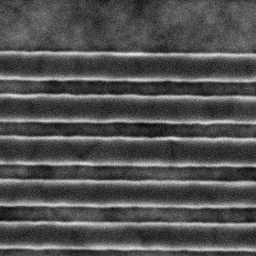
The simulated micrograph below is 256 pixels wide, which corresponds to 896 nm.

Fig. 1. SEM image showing wiring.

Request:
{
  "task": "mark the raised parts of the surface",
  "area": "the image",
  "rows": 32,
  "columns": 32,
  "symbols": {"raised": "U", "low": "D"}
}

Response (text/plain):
DDDDDDDDDDDDDDDDDDDDDDDDDDDDDDDD
DDDDDDDDDDDDDDDDDDDDDDDDDDDDDDDD
DDDDDDDDDDDDDDDDDDDDDDDDDDDDDDDD
DDDDDDDDDDDDDDDDDDDDDDDDDDDDDDDD
DDDDDDDDDDDDDDDDDDDDDDDDDDDDDDDD
DDDDDDDDDDDDDDDDDDDDDDDDDDDDDDDD
UUUDDUDDDDDDDDDDDDDDDDDDDDDDDDDD
UUUUUUUUUUUUUUUUDDUUUUUUUUUUUUUU
UUUUUUUUUUUUUUUUDDUUUUUUUUUUUUUU
UUUUUUUUUUUUUUUUUUUUUUUUUUUUUUUU
DDDDDDDDDDDDDDDDDDDDDDDDDDDDDDDD
DDDDDDDDDDDDDDDDDDDDDDDDDDDDDDDD
UUUUUUUUUUUUUUUUUUUUUUUUUUUUUUUU
UUUUUUUUUUUUUUUUUUUUUUUUUUUUUUUU
UUUUUUUUUUUUUUUUUUUUUUUUUUUUUUUU
DDDDDDDDDDDDDDDDDDDDDDDDDDDDDDDD
DDDDDDDDDDDDDDDDDDDDDDDDDDDDDDDD
UUUUUUUUUUUUUUUUUUUUUDUUUUUUUUUU
UUUUUUUUUUUUUUUUUUUUUUUUUUUUUUUU
UUUUUUUUUDDUUUUUUUUUUUUUUUUUUUUU
UUUDUUUUUDDUUUUUUUUUUUUUUUUUUUUU
DDDDDDDDDDDDDDDDDDDDDDDDDDDDDDDD
UUDDDDDDDDDDDDDDDDDDDDDDDDDDDDDD
UUUUUUUUUUUUUUUUUUUUUUUUUUUUUUUU
UUUUUUUUUUUUUUUUUUUUUUUUUUUUUUUU
UUUUUUUUUUUUUUUUUUUUUUUUUUUUUUUU
DDDDDDDDDDDDDDDDDDDDDDDDDDDDDDDD
DDDDDDDDDDDDDDDDDDDDDDDDDDDDDDDD
UUUUUUUUUUUUUUUUUUUUUUUUUUUUUUUU
UUUUUUUUUUUUUUUUUUUUUUUUUUUUUUUU
UUUUUUUUUUUUUUUUUUUUUUUUUUUUUUUU
DDDDDDDDDDDDDDDDDDDDDDDDDDDDDDDD